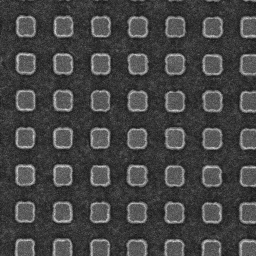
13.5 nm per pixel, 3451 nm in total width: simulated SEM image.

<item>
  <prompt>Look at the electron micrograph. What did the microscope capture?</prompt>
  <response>a regular array of raised bodies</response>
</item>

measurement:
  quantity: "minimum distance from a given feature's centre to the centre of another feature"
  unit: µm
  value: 0.497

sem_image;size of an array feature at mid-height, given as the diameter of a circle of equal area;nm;281